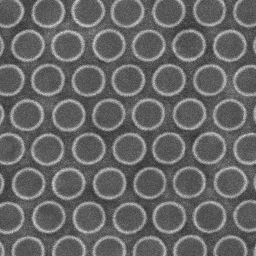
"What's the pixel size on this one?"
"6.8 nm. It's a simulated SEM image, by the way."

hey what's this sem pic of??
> a regular array of raised bodies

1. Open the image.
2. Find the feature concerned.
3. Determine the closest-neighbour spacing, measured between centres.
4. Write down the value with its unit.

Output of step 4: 268 nm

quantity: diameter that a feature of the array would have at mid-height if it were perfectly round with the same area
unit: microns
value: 0.208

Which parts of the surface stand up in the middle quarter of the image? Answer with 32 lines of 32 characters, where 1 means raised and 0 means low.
00000000000000000000000001110000
00001111100001111110000011111000
00011111110001111110000111111100
00111111110011111111000111111100
00111111110011111111001111111100
00111111110001111110000111111100
00011111100001111110000111111000
00001111000000011000000001100000
00000000000000000000000000000000
11100000011110000001111000000111
11110000111111000011111100001111
11111000111111100011111110001111
11111001111111100111111110001111
11111001111111100111111110001111
11111000111111000011111100001111
11110000111110000001111000000111
00000000000000000000000000000000
00000000000000000000000000110000
00001111100000111110000011111000
00011111110001111111000111111100
00011111110001111111001111111100
00111111110001111111001111111100
00011111110001111111000111111100
00011111100001111110000111111000
00001111000000011100000001100000
00000000000000000000000000000000
01100000000110000000111100000111
11110000011111000001111110001111
11111000111111100011111110001111
11111000111111100011111110001111
11111000111111100011111110001111
11110000111111100011111110001111